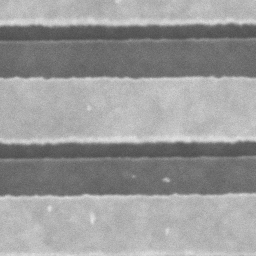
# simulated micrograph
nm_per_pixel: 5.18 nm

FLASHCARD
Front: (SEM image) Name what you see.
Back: lines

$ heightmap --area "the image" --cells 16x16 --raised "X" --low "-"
XXXXXXXXXXXXXXXX
XXXXXXXXXXXX----
----------------
----------------
----------------
XXXXXXXXXXXXXXXX
XXXXXXXXXXXXXXXX
XXXXXXXXXXXXXXXX
XXXXXXXXXXXXXXXX
----------------
----------------
----------------
XXXXXXXXXXXXXXXX
XXXXXXXXXXXXXXXX
XXXXXXXXXXXXXXXX
XXXXXXXXXXXXXXXX